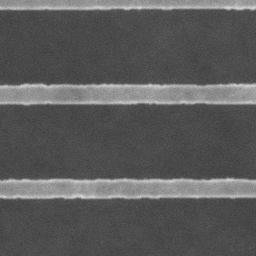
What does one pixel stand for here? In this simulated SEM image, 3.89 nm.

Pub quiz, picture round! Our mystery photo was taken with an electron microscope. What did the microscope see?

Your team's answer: lines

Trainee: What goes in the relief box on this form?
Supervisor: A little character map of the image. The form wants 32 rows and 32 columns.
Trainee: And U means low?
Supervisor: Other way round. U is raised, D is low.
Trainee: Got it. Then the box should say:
UUUUUUUUUUUUUUUUUUUUUUUUUUUUUUUU
DDDDDDDDDDDDDDDDDDDDDDDDDDDDDDDD
DDDDDDDDDDDDDDDDDDDDDDDDDDDDDDDD
DDDDDDDDDDDDDDDDDDDDDDDDDDDDDDDD
DDDDDDDDDDDDDDDDDDDDDDDDDDDDDDDD
DDDDDDDDDDDDDDDDDDDDDDDDDDDDDDDD
DDDDDDDDDDDDDDDDDDDDDDDDDDDDDDDD
DDDDDDDDDDDDDDDDDDDDDDDDDDDDDDDD
DDDDDDDDDDDDDDDDDDDDDDDDDDDDDDDD
DDDDDDDDDDDDDDDDDDDDDDDDDDDDDDDD
DDDDDDDDDDDDDDDDDDDDDDDDDDDDDDDD
UUUUUUUUUUUUUUUUUUUUUUUUUUUUUUUU
UUUUUUUUUUUUUUUUUUUUUUUUUUUUUUUU
DDDDDDDDDDDDDDDDDDDDDDDDDDDDDDDD
DDDDDDDDDDDDDDDDDDDDDDDDDDDDDDDD
DDDDDDDDDDDDDDDDDDDDDDDDDDDDDDDD
DDDDDDDDDDDDDDDDDDDDDDDDDDDDDDDD
DDDDDDDDDDDDDDDDDDDDDDDDDDDDDDDD
DDDDDDDDDDDDDDDDDDDDDDDDDDDDDDDD
DDDDDDDDDDDDDDDDDDDDDDDDDDDDDDDD
DDDDDDDDDDDDDDDDDDDDDDDDDDDDDDDD
DDDDDDDDDDDDDDDDDDDDDDDDDDDDDDDD
DUUUDDUUUUDDUUUUUDUUDUUUDDUUUUUD
UUUUUUUUUUUUUUUUUUUUUUUUUUUUUUUU
UUUUUUUUUUUUUUUUUUUUUUUUUUUUUUUU
DDDDDDDDDDDDDDDDDDDDDDDDDDDDDDDD
DDDDDDDDDDDDDDDDDDDDDDDDDDDDDDDD
DDDDDDDDDDDDDDDDDDDDDDDDDDDDDDDD
DDDDDDDDDDDDDDDDDDDDDDDDDDDDDDDD
DDDDDDDDDDDDDDDDDDDDDDDDDDDDDDDD
DDDDDDDDDDDDDDDDDDDDDDDDDDDDDDDD
DDDDDDDDDDDDDDDDDDDDDDDDDDDDDDDD